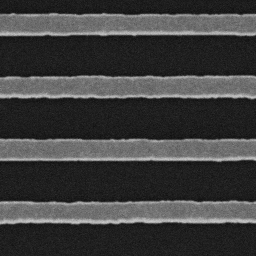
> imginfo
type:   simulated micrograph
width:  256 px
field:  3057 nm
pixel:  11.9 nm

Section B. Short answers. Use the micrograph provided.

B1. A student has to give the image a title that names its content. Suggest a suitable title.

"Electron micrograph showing lines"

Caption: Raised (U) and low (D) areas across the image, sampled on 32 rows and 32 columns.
DDDDDDDDDDDDDDDDDDDDDDDDDDDDDDDD
DDDDDDDDDDDDDDDDDDDDDDDDDDDDDDDD
UUUUUUUUUUUUUUUUUUUUUUUUUUUUUUUU
UUUUUUUUUUUUUUUUUUUUUUUUUUUUUUUU
DDDDDDDDDDDDDDDDDDDDDDDDDDDDDDDD
DDDDDDDDDDDDDDDDDDDDDDDDDDDDDDDD
DDDDDDDDDDDDDDDDDDDDDDDDDDDDDDDD
DDDDDDDDDDDDDDDDDDDDDDDDDDDDDDDD
DDDDDDDDDDDDDDDDDDDDDDDDDDDDDDDD
DDDDDDDDDDDDDDDDDDDDDDDDDDDDDDDD
UUUUUUUUUUUUUUUUUUUUUUUUUUUUUUUU
UUUUUUUUUUUUUUUUUUUUUUUUUUUUUUUU
DDDDDDDDDDDDDDDDDDDDDDDDDDDDDDDD
DDDDDDDDDDDDDDDDDDDDDDDDDDDDDDDD
DDDDDDDDDDDDDDDDDDDDDDDDDDDDDDDD
DDDDDDDDDDDDDDDDDDDDDDDDDDDDDDDD
DDDDDDDDDDDDDDDDDDDDDDDDDDDDDDDD
UUUUUDUUUUUDDDUUUUUDDDDUUUDUUUUU
UUUUUUUUUUUUUUUUUUUUUUUUUUUUUUUU
UUUUUUUUUUUUUUUUUUUUUUUUUUUUUUUU
DDDDDDDDDDDDDDDDDDDDDDDDDDDDDDDD
DDDDDDDDDDDDDDDDDDDDDDDDDDDDDDDD
DDDDDDDDDDDDDDDDDDDDDDDDDDDDDDDD
DDDDDDDDDDDDDDDDDDDDDDDDDDDDDDDD
DDDDDDDDDDDDDDDDDDDDDDDDDDDDDDDD
UUUUUUUUUUUUUUUUUUUUUUUUUUUUUUUU
UUUUUUUUUUUUUUUUUUUUUUUUUUUUUUUU
UUUUUUUUUUUUUUUUUUUUUUUUUUUUUUUU
DDDDDDDDDDDDDDDDDDDDDDDDDDDDDDDD
DDDDDDDDDDDDDDDDDDDDDDDDDDDDDDDD
DDDDDDDDDDDDDDDDDDDDDDDDDDDDDDDD
DDDDDDDDDDDDDDDDDDDDDDDDDDDDDDDD